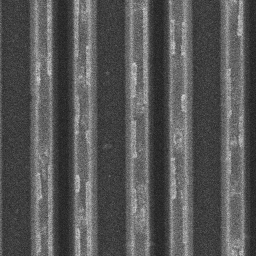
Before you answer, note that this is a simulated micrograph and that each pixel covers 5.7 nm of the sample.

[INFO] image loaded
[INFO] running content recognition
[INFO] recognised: parallel lines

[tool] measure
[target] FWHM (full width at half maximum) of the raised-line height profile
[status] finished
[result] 115 nanometres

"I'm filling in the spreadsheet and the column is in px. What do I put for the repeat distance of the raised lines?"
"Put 47.8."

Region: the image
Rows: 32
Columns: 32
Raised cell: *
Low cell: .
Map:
....***..**.....***..**.....***.
....***..**.....***..**.....***.
....***..**.....***..**.....***.
....***..**.....***..**.....***.
....***..**.....***..**.....***.
....***..**.....***..**.....***.
....***..**.....***..**.....***.
....***..**.....***..**.....***.
....***..**.....***..**.....***.
....***..***....***..**.....***.
....***..***....***..**.....***.
....***..***....***..**.....***.
....***..***....***..***....***.
....***..***....***..***....***.
....***..***....***..***....***.
....***..***....***..***....***.
....***..***....***..***....***.
....***..***....***..***....***.
....***..***....***..***....***.
....***..***....***..***....***.
....***..***....***..***....***.
....***..***....***..***....***.
....***..***....***..***....***.
....***..***....***..***....***.
....***..***....***..***....***.
....***..***....***..***....***.
....***..***....***..***....***.
....***..***....***..***....***.
....***..***....***..***....***.
....***..***....***..***....***.
....***..***....***..***....***.
....***..***....***..***....***.